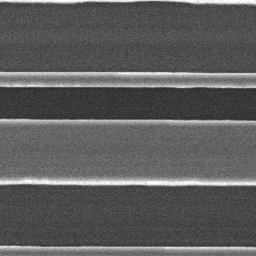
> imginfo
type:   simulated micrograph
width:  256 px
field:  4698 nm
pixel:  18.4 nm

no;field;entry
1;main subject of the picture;lines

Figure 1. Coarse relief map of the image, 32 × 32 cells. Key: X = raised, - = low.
--------------------------------
--------------------------------
--------------------------------
--------------------------------
--------------------------------
--------------------------------
--------------------------------
--------------------------------
--------------------------------
XXXXXXXXXXXXXXXXXXXXXXXXXXXXXXXX
XXXXXXXXXXXXXXXXXXXXXXXXXXXXXXXX
--------------------------------
--------------------------------
--------------------------------
--------------------------------
XXXXXXXXXXXXXXXXXXXXXXXXXXXXXXXX
XXXXXXXXXXXXXXXXXXXXXXXXXXXXXXXX
XXXXXXXXXXXXXXXXXXXXXXXXXXXXXXXX
XXXXXXXXXXXXXXXXXXXXXXXXXXXXXXXX
XXXXXXXXXXXXXXXXXXXXXXXXXXXXXXXX
XXXXXXXXXXXXXXXXXXXXXXXXXXXXXXXX
XXXXXXXXXXXXXXXXXXXXXXXXXXXXXXXX
XXXXXXXXXXXXXXXXXXXXXXXXXXXXXXXX
--------------------------------
--------------------------------
--------------------------------
--------------------------------
--------------------------------
--------------------------------
--------------------------------
--------------------------------
XXXXXXXXXXXXXXXXXXXXXXXXXXXXXXXX